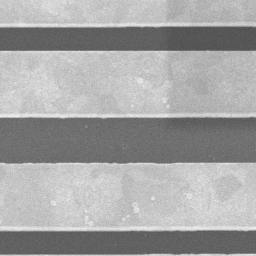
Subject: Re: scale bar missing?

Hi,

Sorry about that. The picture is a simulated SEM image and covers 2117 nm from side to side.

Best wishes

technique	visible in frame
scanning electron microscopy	lines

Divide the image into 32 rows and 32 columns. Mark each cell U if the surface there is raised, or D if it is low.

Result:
UUUUUUUUUUUUUUUUUUUUUUUUUUUUUUUU
UUUUUUUUUUUUUUUUUUUUUUUUUUUUUUUU
UUUUUUUUUUUUUUUUUUUUUUUUUUUUUUUU
DDDDDDDDDDDDDDDDDDDDDDDDDDDDDDDD
DDDDDDDDDDDDDDDDDDDDDDDDDDDDDDDD
DDDDDDDDDDDDDDDDDDDDDDDDDDDDDDDD
UUUUUUUUUUUUUUUUUUUUUUUUUUUUUUUU
UUUUUUUUUUUUUUUUUUUUUUUUUUUUUUUU
UUUUUUUUUUUUUUUUUUUUUUUUUUUUUUUU
UUUUUUUUUUUUUUUUUUUUUUUUUUUUUUUU
UUUUUUUUUUUUUUUUUUUUUUUUUUUUUUUU
UUUUUUUUUUUUUUUUUUUUUUUUUUUUUUUU
UUUUUUUUUUUUUUUUUUUUUUUUUUUUUUUU
UUUUUUUUUUUUUUUUUUUUUUUUUUUUUUUU
UUUUUUUUUUUUUUUUUUUUUUUUUUUUUUUU
DDDDDDDDDDDDDDDDDDDDDDDDDDDDDDDD
DDDDDDDDDDDDDDDDDDDDDDDDDDDDDDDD
DDDDDDDDDDDDDDDDDDDDDDDDDDDDDDDD
DDDDDDDDDDDDDDDDDDDDDDDDDDDDDDDD
DDDDDDDDDDDDDDDDDDDDDDDDDDDDDDDD
UDDUUUUUUUUUUUUDUUUUDUUUUUUUUUUU
UUUUUUUUUUUUUUUUUUUUUUUUUUUUUUUU
UUUUUUUUUUUUUUUUUUUUUUUUUUUUUUUU
UUUUUUUUUUUUUUUUUUUUUUUUUUUUUUUU
UUUUUUUUUUUUUUUUUUUUUUUUUUUUUUUU
UUUUUUUUUUUUUUUUUUUUUUUUUUUUUUUU
UUUUUUUUUUUUUUUUUUUUUUUUUUUUUUUU
UUUUUUUUUUUUUUUUUUUUUUUUUUUUUUUU
UUUUUUUUUUUUUUUUUUUUUUUUUUUUUUUU
DDDDDDDDDDDDDDDDDDDDDDDDDDDDDDDD
DDDDDDDDDDDDDDDDDDDDDDDDDDDDDDDD
DDDDDDDDDDDDDDDDDDDDDDDDDDDDDDDD